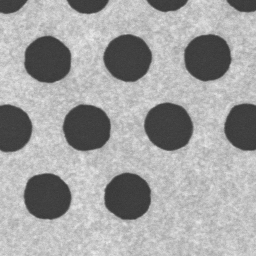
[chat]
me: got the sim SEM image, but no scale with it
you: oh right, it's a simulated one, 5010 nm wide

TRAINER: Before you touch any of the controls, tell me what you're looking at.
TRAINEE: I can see holes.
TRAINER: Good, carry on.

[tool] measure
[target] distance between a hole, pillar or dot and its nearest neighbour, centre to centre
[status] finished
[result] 79.2 pixels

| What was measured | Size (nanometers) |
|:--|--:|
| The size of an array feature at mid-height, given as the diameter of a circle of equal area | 932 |